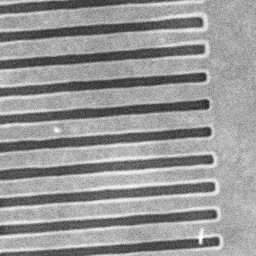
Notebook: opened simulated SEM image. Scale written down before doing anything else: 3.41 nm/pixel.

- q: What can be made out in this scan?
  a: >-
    groups of lines, slits or small figures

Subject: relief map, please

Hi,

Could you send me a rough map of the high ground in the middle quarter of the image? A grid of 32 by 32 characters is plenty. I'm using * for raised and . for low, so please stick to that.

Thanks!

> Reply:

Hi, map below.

********************************
********************************
***************************.....
**************..................
................................
........................********
........************************
********************************
********************************
*************************.......
*************...................
................................
......................**********
...........*********************
********************************
********************************
**************************......
********........................
................................
......................**********
...........*********************
********************************
********************************
*********************...........
********........................
................................
......................**********
.........***********************
********************************
*******************************.
*******************.............
********........................